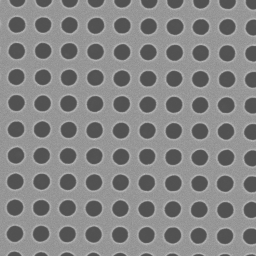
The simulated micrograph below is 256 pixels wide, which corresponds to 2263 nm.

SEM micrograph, a regular array of holes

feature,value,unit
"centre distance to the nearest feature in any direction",230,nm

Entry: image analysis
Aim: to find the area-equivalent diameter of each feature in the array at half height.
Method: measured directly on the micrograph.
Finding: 145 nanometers